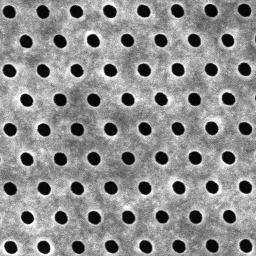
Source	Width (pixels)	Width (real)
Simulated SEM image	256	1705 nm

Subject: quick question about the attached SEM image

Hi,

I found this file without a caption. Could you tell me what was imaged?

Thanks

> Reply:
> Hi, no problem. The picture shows a regular array of holes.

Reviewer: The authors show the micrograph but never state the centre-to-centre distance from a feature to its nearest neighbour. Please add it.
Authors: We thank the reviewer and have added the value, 33.3 px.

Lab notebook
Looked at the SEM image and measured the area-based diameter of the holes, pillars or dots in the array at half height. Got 0.0908 microns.